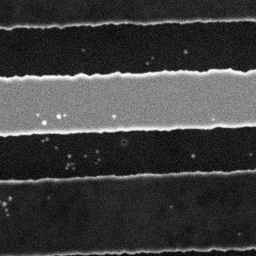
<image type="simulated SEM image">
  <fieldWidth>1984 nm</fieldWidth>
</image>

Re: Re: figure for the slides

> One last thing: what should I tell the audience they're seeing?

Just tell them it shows lines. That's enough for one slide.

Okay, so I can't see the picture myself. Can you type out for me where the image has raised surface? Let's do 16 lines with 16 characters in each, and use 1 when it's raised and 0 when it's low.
1111111111111111
1111111111000000
0000000000000000
0000000000000000
0000000000110111
1111111111111111
1111111111111111
1111111111111111
0000000000000000
0000000000000000
0000000000000000
1111111111111111
1111111111111111
1111111111111111
1111111111111111
1111111111111111